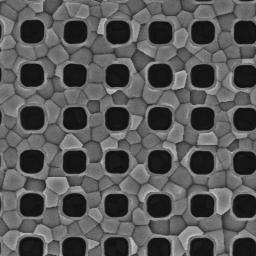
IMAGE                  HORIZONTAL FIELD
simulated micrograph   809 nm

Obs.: a regular array of holes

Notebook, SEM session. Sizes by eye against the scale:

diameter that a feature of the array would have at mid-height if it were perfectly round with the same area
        25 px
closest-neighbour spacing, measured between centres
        134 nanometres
